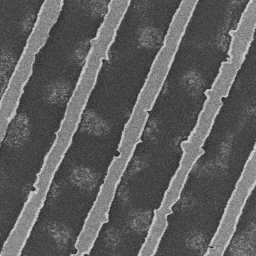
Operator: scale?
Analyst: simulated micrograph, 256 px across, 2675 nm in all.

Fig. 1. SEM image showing one or a few lines or trenches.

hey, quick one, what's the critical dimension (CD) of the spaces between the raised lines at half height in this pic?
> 493 nm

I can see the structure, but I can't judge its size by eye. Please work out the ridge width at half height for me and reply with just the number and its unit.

158 nm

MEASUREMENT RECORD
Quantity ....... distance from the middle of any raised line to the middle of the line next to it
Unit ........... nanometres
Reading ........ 648